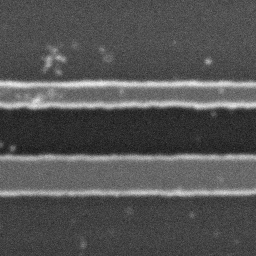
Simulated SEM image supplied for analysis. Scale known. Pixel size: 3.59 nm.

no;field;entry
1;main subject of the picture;lines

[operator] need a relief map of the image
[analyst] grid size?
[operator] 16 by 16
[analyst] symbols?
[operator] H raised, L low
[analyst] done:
LLLLLLLLLLLLLLLL
LLLLLLLLLLLLLLLL
LLLLLLLLLLLLLLLL
LLLLLLLLLLLLLLLL
LLLLLLLLLLLLLLLL
HHHHHHHHHHHHHHHH
HHHHHHHHHHHHHHHH
LLLLLLLLLLLLLLLL
LLLLLLLLLLLLLLLL
LLLLLLLLLLLLLLLL
HHHHHHHHHHHHHHHH
HHHHHHHHHHHHHHHH
LLLLLLLLLLLLLLLL
LLLLLLLLLLLLLLLL
LLLLLLLLLLLLLLLL
LLLLLLLLLLLLLLLL